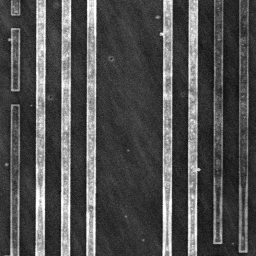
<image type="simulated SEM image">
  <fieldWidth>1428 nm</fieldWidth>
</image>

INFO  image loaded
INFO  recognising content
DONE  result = groups of lines, slits or small figures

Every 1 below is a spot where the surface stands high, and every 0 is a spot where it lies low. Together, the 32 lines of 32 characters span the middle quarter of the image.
11000011000000000000000001100001
11000011000000000000000001100001
11000011000000000000000001100001
11000011000000000000000001100001
10000011000000000000000001100001
10000011000000000000000001100001
10000011000000000000000001100001
10000011000000000000000001100001
10000011000000000000000001100001
10000011000000000000000001100001
10000011000000000000000001100001
10000011000000000000000001100001
10000011000000000000000001100001
10000011000000000000000001100001
10000011000000000000000001100001
10000011000000000000000001100001
10000011000000000000000001100001
10000011000000000000000001100001
10000011000000000000000001100001
10000011000000000000000001100001
10000011000000000000000001100001
10000011000000000000000001100001
10000011000000000000000001100001
10000011000000000000000001100001
10000011000000000000000001100001
10000011000000000000000001100001
10000011000000000000000001100001
10000011000000000000000001100001
10000011000000000000000001100001
10000011000000000000000001100001
10000011000000000000000001100001
10000011000000000000000001100001